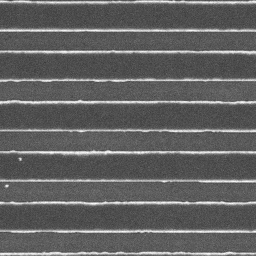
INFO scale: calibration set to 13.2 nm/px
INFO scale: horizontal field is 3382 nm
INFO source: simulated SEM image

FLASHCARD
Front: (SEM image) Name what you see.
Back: lines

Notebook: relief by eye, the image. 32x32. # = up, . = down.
################################
################################
################################
################################
................................
................................
################################
################################
################################
################################
................................
................................
................................
################################
################################
################################
................................
................................
................................
################################
################################
################################
################################
................................
................................
################################
################################
################################
################################
................................
................................
................................